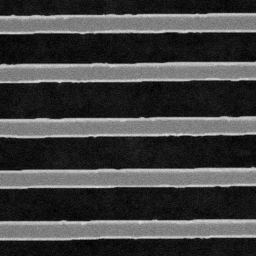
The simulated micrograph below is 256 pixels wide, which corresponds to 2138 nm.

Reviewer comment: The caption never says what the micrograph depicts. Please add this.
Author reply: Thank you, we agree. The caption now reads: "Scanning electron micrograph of lines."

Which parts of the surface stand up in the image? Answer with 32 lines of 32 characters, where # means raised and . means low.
................................
................................
################################
################################
................................
................................
................................
................................
################################
################################
................................
................................
................................
................................
................................
################################
################################
................................
................................
................................
................................
################################
################################
##..............................
................................
................................
................................
................................
################################
################################
................................
................................